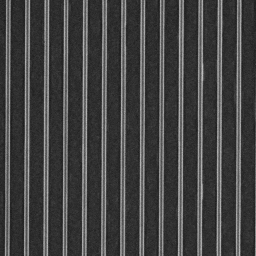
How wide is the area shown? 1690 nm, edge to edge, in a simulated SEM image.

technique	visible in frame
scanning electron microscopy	parallel lines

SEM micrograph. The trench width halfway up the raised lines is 0.101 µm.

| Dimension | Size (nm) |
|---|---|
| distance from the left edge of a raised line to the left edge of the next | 127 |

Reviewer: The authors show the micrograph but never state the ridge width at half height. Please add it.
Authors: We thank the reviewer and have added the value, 23.9 nm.